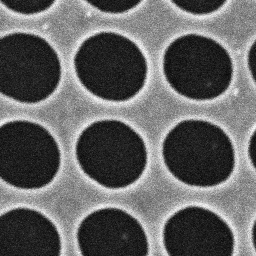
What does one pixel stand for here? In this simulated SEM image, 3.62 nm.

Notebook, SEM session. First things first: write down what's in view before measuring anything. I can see holes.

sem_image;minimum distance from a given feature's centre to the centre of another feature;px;86.5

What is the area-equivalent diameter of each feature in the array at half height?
256 nm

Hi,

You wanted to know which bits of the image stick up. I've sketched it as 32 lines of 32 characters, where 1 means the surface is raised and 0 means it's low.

00000001111000000111110000001111
11000111111110001111111000011111
11111111111111111111111111111111
11111111111111111111111111111111
00000111111000001111111001111111
00000011110000000111100000011111
00000001110000000011100000001110
00000000100000000011000000000110
00000000100000000011000000000110
00000000110000000011100000000110
00000001110000000011100000000111
00000001111000000111110000001111
11000011111110001111111100111111
11111111111111111111111111111111
11111111111111111111111111111111
00000111111000001111110000011111
00000011110000000111100000001111
00000001110000000011000000000110
00000001100000000011000000000110
00000000110000000011000000000110
00000000110000000011100000000111
00000001110000000011100000000111
00000001111100000111110000001111
11000111111110001111111111111111
11111111111111111111111111111111
11111111111111111111111111111111
10000111111100001111110000011111
00000011110000000111100000001111
00000001110000000011000000000111
00000001110000000011000000000110
00000000110000000001000000000111
00000000110000000001100000000111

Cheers